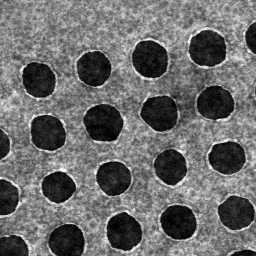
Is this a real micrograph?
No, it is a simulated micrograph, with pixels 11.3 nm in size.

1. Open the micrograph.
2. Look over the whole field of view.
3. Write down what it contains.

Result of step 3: a regular array of holes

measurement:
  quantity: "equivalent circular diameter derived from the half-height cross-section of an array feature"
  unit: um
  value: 0.41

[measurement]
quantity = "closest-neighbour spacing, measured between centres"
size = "621 nm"